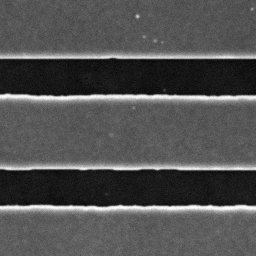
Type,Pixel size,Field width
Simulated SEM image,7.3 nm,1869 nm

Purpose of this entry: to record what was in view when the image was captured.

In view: lines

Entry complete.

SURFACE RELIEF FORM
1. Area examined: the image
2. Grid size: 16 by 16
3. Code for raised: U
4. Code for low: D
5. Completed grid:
UUUUUUUUUUUUUUUU
UUUUUUUUUUUUUUUU
UUUUUUUUUUUUUUUU
UUUUUUUUUUUUUUUU
DDDDDDDDDDDDDDDD
DDDDDDDDDDDDDDDD
UUUUUUUUUUUUUUUU
UUUUUUUUUUUUUUUU
UUUUUUUUUUUUUUUU
UUUUUUUUUUUUUUUU
UUUUUUUUUUUUUUUU
DDDDDDDDDDDDDDDD
DDDDDDDDDDDDDDDD
UUUUUUUUUUUUUUUU
UUUUUUUUUUUUUUUU
UUUUUUUUUUUUUUUU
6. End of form